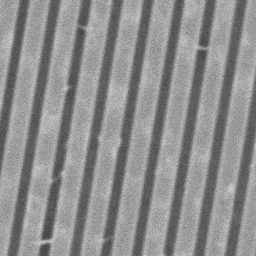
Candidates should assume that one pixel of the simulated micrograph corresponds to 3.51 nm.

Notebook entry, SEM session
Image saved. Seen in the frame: parallel lines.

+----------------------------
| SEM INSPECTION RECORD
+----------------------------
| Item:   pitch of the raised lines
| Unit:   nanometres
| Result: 108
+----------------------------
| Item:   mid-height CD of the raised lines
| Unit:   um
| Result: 0.0722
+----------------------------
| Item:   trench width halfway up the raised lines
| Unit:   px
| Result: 10.4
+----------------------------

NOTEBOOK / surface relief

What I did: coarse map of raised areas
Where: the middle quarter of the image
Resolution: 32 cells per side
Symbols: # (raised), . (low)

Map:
#...#####...#####...#####..#####
#...#####...#####..######..#####
#...#####...#####..#####...#####
#...#####...####...#####...#####
#...#####..#####...#####...#####
#..#####...#####...#####...#####
#..#####...#####...#####..######
...#####...#####..######..#####.
...#####...#####..#####...#####.
...#####...####...#####...#####.
...#####..#####...#####...#####.
..#####...#####...#####...#####.
..#####...#####...#####..######.
..#####...#####..######..#####..
..#####...#####..#####...#####..
..#####...####...#####...#####..
.######..#####...#####...#####..
.#####...#####...#####...#####..
.#####...#####...#####..######..
.#####...#####..######..#####...
.#####...#####..#####...#####...
.#####..#####...#####...#####...
######..#####...#####...#####...
#####...#####...#####...#####..#
#####...#####...#####..######..#
#####...#####..######..#####...#
#####...#####..#####...#####...#
#####..#####...#####...#####...#
#####..#####...#####...#####...#
####...#####...#####...#####..##
####...#####...#####..######..##
####...#####..######..#####...##